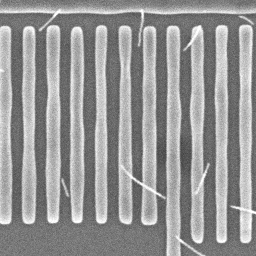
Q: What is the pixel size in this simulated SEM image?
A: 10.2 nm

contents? wiring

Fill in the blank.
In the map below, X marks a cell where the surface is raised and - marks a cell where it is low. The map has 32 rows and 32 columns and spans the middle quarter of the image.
--XXX---XX----XX----XXX---XXX---
--XXX---XX----XX----XXX---XXX---
--XXX---XX----XX----XXX---XXX---
--XXX---XX----XX----XXX---XXX---
--XXX---XX----XX----XXX---XXX---
--XXX---XX----XX----XXX---XXX---
--XXX---XX----XX----XXX---XXX---
--XXX---XX----XX----XXX---XXX---
--XXX---XX----XX----XXX---XXX---
--XX----XX----XX----XXX---XXX---
--XX----XX----XX----XXX---XXX---
--XX----XX----XX----XXX---XXX---
--XX----XX----XXX---XXX---XXX---
--XX----XX----XXX---XXX---XXX---
--XXX---XX----XXX---XXX---XXX---
--XXX---XXX---XXX---XXX---XXX---
--XXX---XXX---XXX---XXX---XXX---
--XXX---XXX---XXX---XXX---XXX---
--XXX---XXX---XXX---XXX---XXX---
--XXX---XXX---XXX---XXX---XXX---
--XXX---XXX---XXX---XXX---XXX---
--XXX---XXX---XXX---XXX---XXX---
--XXX---XXX---XXX---XXX---XXX---
--XXX---XXX---XXX---XXX---XXX---
--XXX---XXX---XXX---XXX---XXX---
--XXX---XXX---XXX---XXX---XXX---
--XXX---XXX---XXX---XXX---XXX---
--XXX---XXX---XXX---XXX---XXX---
--XXX---XXX---XXX---XXX---XXX---
--XXX---XXX---XXX---XXX---XXX---
--XXX---XXX---XXX---XXX---XXX---
--XXX---XXX---XXX---XXX---XXX---